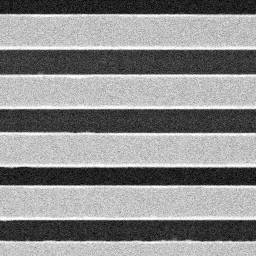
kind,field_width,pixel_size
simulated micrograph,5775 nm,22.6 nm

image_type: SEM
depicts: lines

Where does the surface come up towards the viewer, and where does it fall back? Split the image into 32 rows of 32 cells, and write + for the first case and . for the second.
................................
................................
++++++++++++++++++++++++++++++++
++++++++++++++++++++++++++++++++
++++++++++++++++++++++++++++++++
++++++++++++++++++++++++++++++++
................................
................................
................................
.+++++++++++++++++++++++++++++++
++++++++++++++++++++++++++++++++
++++++++++++++++++++++++++++++++
++++++++++++++++++++++++++++++++
++++++++++++++++++++++++++++++++
................................
................................
................................
++++++++++++++++++++++++++++++++
++++++++++++++++++++++++++++++++
++++++++++++++++++++++++++++++++
++++++++++++++++++++++++++++++++
................................
................................
++++++++++++++++++++++++++++++++
++++++++++++++++++++++++++++++++
++++++++++++++++++++++++++++++++
++++++++++++++++++++++++++++++++
++..............................
................................
................................
++++++++++++++++++++++++++++++++
++++++++++++++++++++++++++++++++